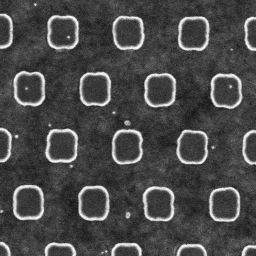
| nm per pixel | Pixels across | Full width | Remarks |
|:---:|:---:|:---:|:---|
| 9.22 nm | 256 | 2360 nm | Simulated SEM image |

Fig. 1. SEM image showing a regular array of raised bodies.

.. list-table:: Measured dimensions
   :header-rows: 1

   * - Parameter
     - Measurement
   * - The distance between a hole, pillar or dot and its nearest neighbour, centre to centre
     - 602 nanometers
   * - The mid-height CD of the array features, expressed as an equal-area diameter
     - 0.301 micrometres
